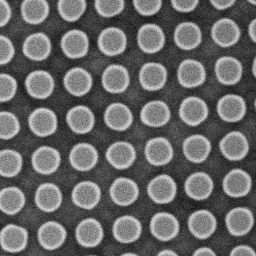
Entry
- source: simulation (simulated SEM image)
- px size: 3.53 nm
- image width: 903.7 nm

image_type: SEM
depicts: an array of small figures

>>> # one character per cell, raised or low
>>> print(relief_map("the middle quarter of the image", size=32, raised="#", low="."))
............##......#####....###
..###.....######...######....###
.#####....######...######....###
#######...######...######....###
#######...######...######....###
#######...######....#####.....##
.#####.....####.................
..###...........................
...............................#
......................##......##
...........####.....######...###
..####.....#####....######...###
.######...#######..#######...###
.######...#######..#######...###
.######...#######...######....##
.######....#####......#.........
..#####......#..................
................................
...............................#
.....................#####....##
...####.....#####....######...##
..######...#######..#######...##
..######...#######..#######...##
..######...#######...######....#
..######...######....#####......
..#####.....####................
....##..........................
................................
.......................####....#
.............####.....#####....#
...#####....######...#######..##
..#######...######...#######..##